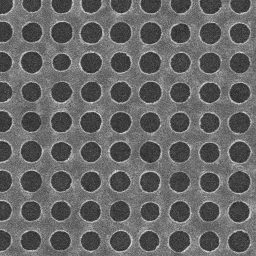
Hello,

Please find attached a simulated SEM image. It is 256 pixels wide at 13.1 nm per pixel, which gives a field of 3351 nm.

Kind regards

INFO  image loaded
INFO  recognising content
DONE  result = a regular array of holes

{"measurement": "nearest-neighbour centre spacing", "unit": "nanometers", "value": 387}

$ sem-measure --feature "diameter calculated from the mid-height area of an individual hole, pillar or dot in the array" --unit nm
272